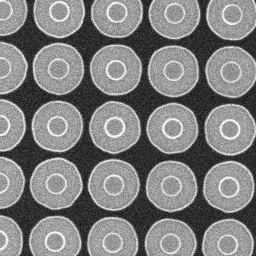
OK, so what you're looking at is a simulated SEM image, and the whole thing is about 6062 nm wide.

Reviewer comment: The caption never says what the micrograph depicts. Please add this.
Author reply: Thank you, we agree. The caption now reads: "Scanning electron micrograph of an array of small figures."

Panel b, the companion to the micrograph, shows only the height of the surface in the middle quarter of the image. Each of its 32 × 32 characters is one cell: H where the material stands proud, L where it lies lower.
HLLLLHHLLLLHHHHLLLLHHLLLLHHHHLLL
HLLLLHHLLLLHHHHLLLLHHLLLLHHHHHLL
HLLLLHHLLLLHHHHLLLLHHLLLLHHHHHLL
LLLLHHHLLLLLHHLLLLLHHLLLLLHHHLLL
LLLLHHHLLLLLLLLLLLLHHHLLLLLLLLLL
LLLHHHHHLLLLLLLLLLHHHHLLLLLLLLLL
LLHHHHHHHHLLLLLLLHHHHHHLLLLLLLLH
HHHHHHHHHHHLLLHHHHHHHHHHHLLLLLHH
HHHHHHHHHHHHHHHHHHHHHHHHHHHHHHHH
HHHHHHHHHHHLLHHHHHHHHHHHHHHHHHHH
LLHHHHHHHHLLLLLLHHHHHHHHHLLLLLHH
LLLHHHHHLLLLLLLLLHHHHHHLLLLLLLLH
LLLLHHHHLLLLLLLLLLHHHHLLLLLLLLLL
LLLLHHHLLLLLLLLLLLHHHHLLLLLLLLLL
LLLLLHHLLLLHHHHLLLLHHLLLLLHHHLLL
HLLLLHHLLLHHHHHLLLLHHLLLLHHHHLLL
LLLLLHHLLLHHHHHLLLLHHLLLLHHHHLLL
LLLLHHHLLLLHHHLLLLLHHLLLLHHHHLLL
LLLLHHHLLLLLLLLLLLHHHLLLLLLLLLLL
LLLHHHHHLLLLLLLLLLHHHHLLLLLLLLLL
LLHHHHHHHLLLLLLLLHHHHHHLLLLLLLLH
HHHHHHHHHHLLLLLHHHHHHHHHLLLLLLHH
HHHHHHHHHHHHHHHHHHHHHHHHHHHHHHHH
HHHHHHHHHHHHHHHHHHHHHHHHHHHHHHHH
LHHHHHHHHHLLLLLHHHHHHHHHHHLLHHHH
LLLHHHHHLLLLLLLLLHHHHHHLLLLLLLLH
LLLHHHHLLLLLLLLLLHHHHHLLLLLLLLLH
LLLLHHHLLLLLLLLLLLHHHLLLLLLLLLLL
LLLLHHHLLLLHHHLLLLHHHLLLLHHHLLLL
LLLLHHLLLLHHHHHLLLLHHLLLLHHHHLLL
LLLLHHLLLLHHHHHLLLLHHLLLLHHHHLLL
LLLLHHLLLLHHHHLLLLHHHLLLLHHHHLLL